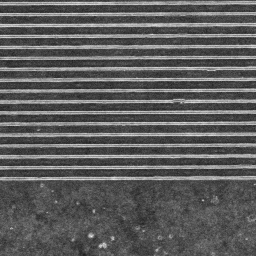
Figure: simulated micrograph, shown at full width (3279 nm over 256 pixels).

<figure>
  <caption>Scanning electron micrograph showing parallel lines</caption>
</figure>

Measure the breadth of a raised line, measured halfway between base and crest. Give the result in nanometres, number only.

36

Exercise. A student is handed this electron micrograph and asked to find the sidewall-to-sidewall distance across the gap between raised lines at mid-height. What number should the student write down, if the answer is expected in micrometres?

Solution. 0.109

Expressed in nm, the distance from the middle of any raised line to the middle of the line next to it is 140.